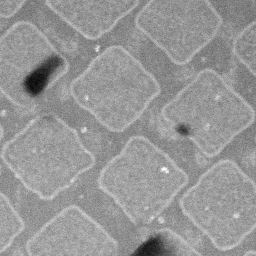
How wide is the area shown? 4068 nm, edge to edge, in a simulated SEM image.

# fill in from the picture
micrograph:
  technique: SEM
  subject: raised bodies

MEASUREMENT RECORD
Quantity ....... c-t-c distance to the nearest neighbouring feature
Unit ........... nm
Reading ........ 1510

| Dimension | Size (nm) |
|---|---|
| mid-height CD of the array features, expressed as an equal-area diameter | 1190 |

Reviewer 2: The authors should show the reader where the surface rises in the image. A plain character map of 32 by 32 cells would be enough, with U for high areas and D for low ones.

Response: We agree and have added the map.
UUUDDDUUUUUUUUUUUDDUUUUUUUDDDDDD
UUDDDDDUUUUUUUUUDDUUUUUUUUUDDDDD
DDDDDDDDUUUUUUUDDUUUUUUUUUUUDDDD
DDUUDDDDDUUUUUDDDDUUUUUUUUUDDDDU
DUUUUDDDDDDUDDDDDDDUUUUUUUUDDDUU
UUUUUUDDDDDDDDDDDDDDUUUUUUDDDUUU
UUUUUUUDDDDDDUUUDDDDDUUUDDDDDUUU
UUUUUUUUDDDDUUUUUDDDDDUDDDDDDDUU
UUUUUUUUDDDUUUUUUUDDDDDDDDDDDDDU
UUUUUUUDDDUUUUUUUUUDDDDDDUUDDDDD
UUUUUUDDDUUUUUUUUUUUDDDDUUUUDDDD
UUUUUDDDDUUUUUUUUUUUDDDUUUUUUDDD
DDUUDDDDDDUUUUUUUUUDDDUUUUUUUUDD
DDDDDDDDDDDUUUUUUUDDDUUUUUUUUUUD
DDDDDUUDDDDDUUUUUDDDDUUUUUUUUUUU
DDDDUUUUDDDDDUUUDDDDDDUUUUUUUUUD
DDDUUUUUUDDDDDDDDDDDDDDUUUUUUUDD
DDUUUUUUUUDDDDDDUUDDDDDDUUUUUDDD
DUUUUUUUUUDDDDDDUUUDDDDDDUUUDDDD
UUUUUUUUUUUDDDDUUUUUUDDDDDDDDDDD
DUUUUUUUUUUUDDUUUUUUUUDDDDDUUDDD
DDUUUUUUUUDDDUUUUUUUUUUDDDUUUUDD
DDDUUUUUUDDDUUUUUUUUUUUDDUUUUUUD
DDDDUUUUDDDDDUUUUUUUUUUDUUUUUUUU
DDDDDUUDDDDDDDUUUUUUUUDUUUUUUUUU
UDDDDDDDDDDDDDDUUUUUUDDUUUUUUUUU
UUDDDDDDUUDDDDDDUUUUDDDUUUUUUUUU
UUUDDDDUUUUDDDDDDUUDDDDDUUUUUUUU
UUUDDUUUUUUUDDDDDDDDDDDDDUUUUUUU
UUDDDUUUUUUUUDDDDDDUUUDDDDUUUUDD
UDDDUUUUUUUUUUDDDDUUUUUDDDDUUUDD
DDDDUUUUUUUUUUDDDUUUUUUUDDDDDDDD